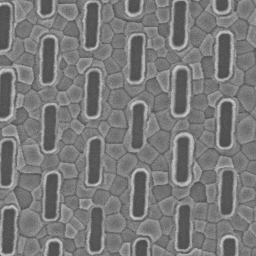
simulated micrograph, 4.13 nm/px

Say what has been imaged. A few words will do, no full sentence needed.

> a regular array of holes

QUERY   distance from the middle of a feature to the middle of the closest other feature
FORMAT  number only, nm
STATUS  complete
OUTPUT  229